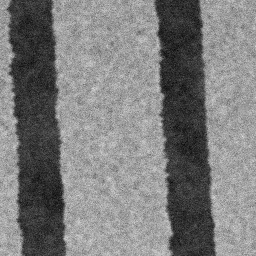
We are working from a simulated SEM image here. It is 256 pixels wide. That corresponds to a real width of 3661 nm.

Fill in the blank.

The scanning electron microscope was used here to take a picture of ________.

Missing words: one or a few lines or trenches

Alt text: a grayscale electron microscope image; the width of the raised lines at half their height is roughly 1.47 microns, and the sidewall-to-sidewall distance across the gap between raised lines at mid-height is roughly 649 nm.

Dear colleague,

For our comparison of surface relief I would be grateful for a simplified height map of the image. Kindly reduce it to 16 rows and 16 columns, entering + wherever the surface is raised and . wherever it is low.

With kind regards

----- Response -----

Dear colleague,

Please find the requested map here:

+..+++++++...+++
+..+++++++...+++
+..+++++++...+++
+...++++++...+++
+...++++++...+++
+...++++++...+++
+...++++++...+++
+...++++++...+++
+...++++++...+++
+...++++++...+++
+...++++++...+++
+...++++++...+++
+...++++++...+++
+...++++++...+++
+...+++++++..+++
+...+++++++..+++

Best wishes